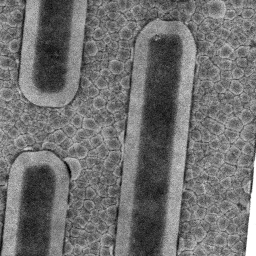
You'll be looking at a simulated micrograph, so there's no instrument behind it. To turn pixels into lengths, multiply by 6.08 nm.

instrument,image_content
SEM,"one or a few lines or trenches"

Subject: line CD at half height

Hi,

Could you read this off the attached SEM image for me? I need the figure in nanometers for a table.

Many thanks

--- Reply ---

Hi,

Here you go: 285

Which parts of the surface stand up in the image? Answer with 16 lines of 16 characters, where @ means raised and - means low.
--@@@-----------
--@@@-----------
--@@@----@@@----
--@@@----@@@----
--@@@----@@@----
--@@-----@@@----
--------@@@@----
--------@@@-----
--------@@@-----
--------@@@-----
-@@@----@@@-----
-@@@----@@@-----
-@@@----@@@-----
-@@@----@@@-----
-@@@----@@@-----
-@@@----@@@-----